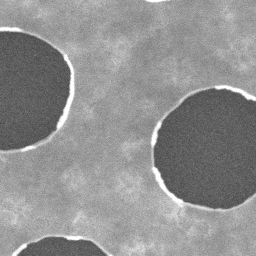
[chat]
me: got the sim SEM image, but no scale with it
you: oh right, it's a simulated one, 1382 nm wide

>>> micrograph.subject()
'holes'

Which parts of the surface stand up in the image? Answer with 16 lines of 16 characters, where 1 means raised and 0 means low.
1111111111111111
1111111111111111
0001111111111111
0000111111111111
0000111111111111
0000111111111111
0000111111100000
0000111111000000
0001111111000000
1111111111000000
1111111111000000
1111111111000000
1111111111100001
1111111111111111
1111111111111111
1100001111111111